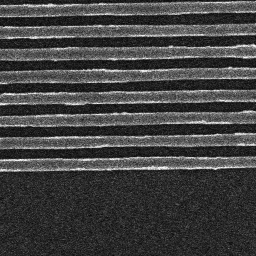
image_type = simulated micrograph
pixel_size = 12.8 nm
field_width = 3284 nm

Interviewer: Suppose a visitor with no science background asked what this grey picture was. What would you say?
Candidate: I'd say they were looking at parallel lines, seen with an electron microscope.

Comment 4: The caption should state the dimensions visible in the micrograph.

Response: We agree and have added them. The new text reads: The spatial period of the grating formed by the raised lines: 283 nm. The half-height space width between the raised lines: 0.128 um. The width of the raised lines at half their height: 154 nanometres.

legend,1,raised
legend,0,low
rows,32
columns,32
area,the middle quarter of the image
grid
00000000000000000000000000000000
00001111111001000000000111111111
11111111111111111111111111111111
11111111111111111111111111111111
11111111111111000000000000000000
00000000000000000000000000000000
00000000000000000000000000000000
11111111111111111111111111111111
11111111111111111111111111111111
11111111111111111111111111111100
00000000000000000000000000000000
00000000000000000000000000000000
00000000000011111111111111111111
11111111111111111111111111111111
11111111111111111111111111111111
00000000110000000000000000000000
00000000000000000000000000000000
00000000000000000000000000000000
11111111111111111111111111111111
11111111111111111111111111111111
11111111111111000000000000111110
00000000000000000000000000000000
00000000000000000000000000000000
00000000000000111111111111111111
11111111111111111111111111111111
11111111111111111111111111111111
00000000110100000000000000000000
00000000000000000000000000000000
00000000000000000000000000000000
00000000000000000000000000000000
00000000000000000000000000000000
00000000000000000000000000000000